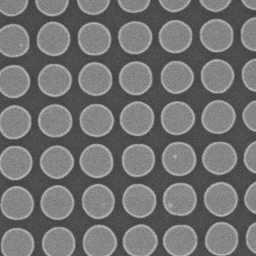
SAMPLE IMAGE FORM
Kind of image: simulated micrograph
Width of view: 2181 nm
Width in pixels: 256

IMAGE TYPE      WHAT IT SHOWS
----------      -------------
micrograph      an array of small figures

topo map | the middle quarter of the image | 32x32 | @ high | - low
-----@@@@@-----@@@@@@----@@@@@@-
@---@@@@@@@---@@@@@@@@---@@@@@@@
@@--@@@@@@@@--@@@@@@@@--@@@@@@@@
@@--@@@@@@@@--@@@@@@@@--@@@@@@@@
@@--@@@@@@@@--@@@@@@@@--@@@@@@@@
@@--@@@@@@@@--@@@@@@@@---@@@@@@@
@----@@@@@@----@@@@@@-----@@@@--
------@@@@-------@@-------------
--------------------------------
-----------------@@--------@@---
------@@@@------@@@@@----@@@@@@-
@----@@@@@@----@@@@@@@---@@@@@@@
@@--@@@@@@@@--@@@@@@@@--@@@@@@@@
@@--@@@@@@@@--@@@@@@@@--@@@@@@@@
@@--@@@@@@@@--@@@@@@@@--@@@@@@@@
@@--@@@@@@@@--@@@@@@@@---@@@@@@@
@----@@@@@@@---@@@@@@----@@@@@@-
------@@@@-------@@@-------@@---
--------------------------------
--------------------------------
------@@@@------@@@@@-----@@@@@@
@----@@@@@@----@@@@@@@---@@@@@@@
@@--@@@@@@@@---@@@@@@@---@@@@@@@
@@--@@@@@@@@---@@@@@@@@--@@@@@@@
@@--@@@@@@@@---@@@@@@@@--@@@@@@@
@@--@@@@@@@@---@@@@@@@---@@@@@@@
@@---@@@@@@@---@@@@@@@----@@@@@@
@-----@@@@@-----@@@@@------@@@@-
--------------------------------
--------------------------------
-------@@@-------@@@-------@@@@@
@----@@@@@@@---@@@@@@@----@@@@@@